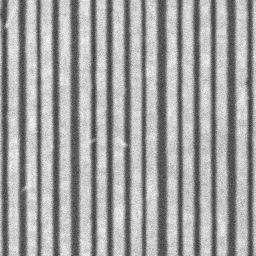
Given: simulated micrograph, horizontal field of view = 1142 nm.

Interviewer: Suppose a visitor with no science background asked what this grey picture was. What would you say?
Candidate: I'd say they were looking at parallel lines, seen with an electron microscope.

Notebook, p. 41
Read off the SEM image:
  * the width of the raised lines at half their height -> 0.0435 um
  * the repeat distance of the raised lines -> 78.6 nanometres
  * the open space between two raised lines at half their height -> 7.13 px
